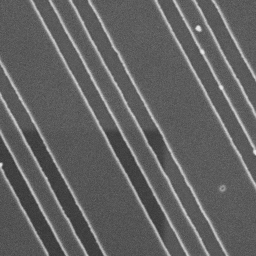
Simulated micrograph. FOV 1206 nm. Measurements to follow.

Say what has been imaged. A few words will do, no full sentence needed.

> lines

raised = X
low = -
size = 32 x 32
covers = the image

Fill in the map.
XXXX--XXX--XXXXXXXXX--XXX--XXXXX
XXXXX--XXX--XXXXXXXX--XXX--XXXXX
XXXXX--XXX--XXXXXXXXX--XXX--XXXX
XXXXXX--XXX--XXXXXXXX---XX--XXXX
XXXXXX---XX--XXXXXXXXX--XXX--XXX
XXXXXXX--XXX--XXXXXXXX---XX---XX
XXXXXXX---XX---XXXXXXXX--XXX--XX
XXXXXXXX--XXX--XXXXXXXXX--XX---X
XXXXXXXXX--XX---XXXXXXXX--XXX--X
-XXXXXXXX--XXX--XXXXXXXXX--XX---
-XXXXXXXXX--XXX--XXXXXXXX--XXX--
--XXXXXXXX--XXX--XXXXXXXXX--XXX-
---XXXXXXXX--XXX--XXXXXXXX--XXX-
X--XXXXXXXX--XXX--XXXXXXXXX--XXX
XX--XXXXXXXX--XXX--XXXXXXXX---XX
XX--XXXXXXXX---XX--XXXXXXXXX--XX
XXX--XXXXXXXX--XXX--XXXXXXXX---X
XXX--XXXXXXXX---XX---XXXXXXXX--X
-XXX--XXXXXXXX--XXX--XXXXXXXXX--
--XX--XXXXXXXX---XX---XXXXXXXX--
--XXX--XXXXXXXX--XXX--XXXXXXXXX-
---XX--XXXXXXXXX--XX---XXXXXXXX-
X--XXX--XXXXXXXX--XXX--XXXXXXXXX
XX--XX---XXXXXXXX--XXX--XXXXXXXX
XX--XXX--XXXXXXXX--XXX--XXXXXXXX
XXX--XX---XXXXXXXX--XXX--XXXXXXX
XXX--XXX--XXXXXXXX--XXX--XXXXXXX
XXXX--XXX--XXXXXXXX--XXX--XXXXXX
XXXX--XXX--XXXXXXXX---XX--XXXXXX
XXXXX--XXX--XXXXXXXX--XXX--XXXXX
XXXXX--XXX--XXXXXXXX---XX---XXXX
XXXXXX--XXX--XXXXXXXX--XXX--XXXX